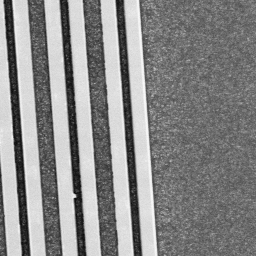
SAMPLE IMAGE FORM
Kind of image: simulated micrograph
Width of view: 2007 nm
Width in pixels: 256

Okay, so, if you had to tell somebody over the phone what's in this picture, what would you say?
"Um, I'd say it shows parallel lines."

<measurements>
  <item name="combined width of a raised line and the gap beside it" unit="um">0.216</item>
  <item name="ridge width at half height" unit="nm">106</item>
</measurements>